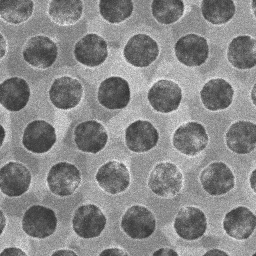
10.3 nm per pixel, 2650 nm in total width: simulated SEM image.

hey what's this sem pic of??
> a regular array of holes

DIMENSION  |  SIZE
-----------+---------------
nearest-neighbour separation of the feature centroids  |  499 nm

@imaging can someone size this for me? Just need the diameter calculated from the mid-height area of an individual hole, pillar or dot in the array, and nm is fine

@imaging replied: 348